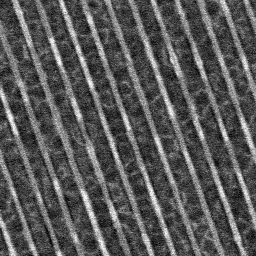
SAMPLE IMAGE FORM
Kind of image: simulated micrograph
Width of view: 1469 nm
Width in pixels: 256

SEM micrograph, parallel lines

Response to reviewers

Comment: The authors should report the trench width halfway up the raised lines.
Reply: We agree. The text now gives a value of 98.7 nm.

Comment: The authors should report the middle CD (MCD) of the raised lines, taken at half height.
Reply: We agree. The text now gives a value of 4.48 pixels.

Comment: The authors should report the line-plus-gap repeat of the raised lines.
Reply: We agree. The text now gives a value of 125 nanometers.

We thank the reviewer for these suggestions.